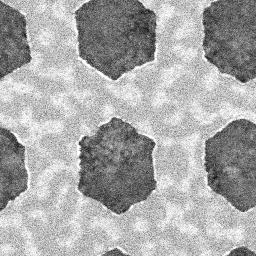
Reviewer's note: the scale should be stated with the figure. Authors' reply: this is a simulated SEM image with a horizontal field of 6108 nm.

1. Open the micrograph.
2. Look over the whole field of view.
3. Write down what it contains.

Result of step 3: holes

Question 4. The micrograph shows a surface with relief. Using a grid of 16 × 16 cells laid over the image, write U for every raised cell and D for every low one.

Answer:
DUUUUDDDDUUUUDDD
DDUUUDDDDDUUUDDD
DDUUUDDDDDUUUDDD
DDUUUDDDDDUUUDDD
DUUUUUDDUUUUUUDD
UUUUUUUUUUUUUUUU
UUUUUUUUUUUUUUUU
UUUUUUUDUUUUUUUD
DUUUUDDDDUUUUDDD
DDUUUDDDDDUUUDDD
DDUUUDDDDDUUUDDD
DDUUUDDDDDUUUDDD
DUUUUUDDDUUUUUDD
UUUUUUUUUUUUUUUU
UUUUUUUUUUUUUUUU
UUUUUUUUUUUUUUUU